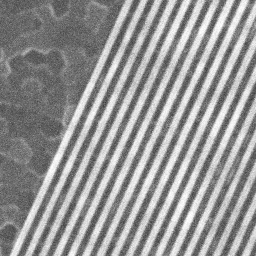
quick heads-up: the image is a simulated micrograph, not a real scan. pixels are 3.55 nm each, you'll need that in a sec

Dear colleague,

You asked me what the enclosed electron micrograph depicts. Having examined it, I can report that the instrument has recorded parallel lines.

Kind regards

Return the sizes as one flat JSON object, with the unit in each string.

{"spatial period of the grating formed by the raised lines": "46.9 nm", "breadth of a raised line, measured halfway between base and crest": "19.9 nanometers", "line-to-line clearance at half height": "26.3 nanometers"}